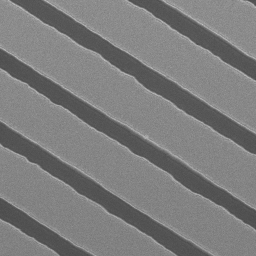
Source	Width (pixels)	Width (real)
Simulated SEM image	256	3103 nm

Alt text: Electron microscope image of lines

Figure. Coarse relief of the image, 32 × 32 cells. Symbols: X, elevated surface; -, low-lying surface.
XX----XXXXXXXXXXX----XXXXXXXXXXX
XXXX----XXXXXXXXXXX---XXXXXXXXXX
XXXXX----XXXXXXXXXXX----XXXXXXXX
XXXXXXX----XXXXXXXXXXX----XXXXXX
XXXXXXXX----XXXXXXXXXXX----XXXXX
XXXXXXXXXX----XXXXXXXXXXX----XXX
-XXXXXXXXXXX----XXXXXXXXXX----XX
--XXXXXXXXXXX----XXXXXXXXXXX----
----XXXXXXXXXXX----XXXXXXXXXX---
XX---XXXXXXXXXXXX---XXXXXXXXXXX-
XXX----XXXXXXXXXXX----XXXXXXXXXX
XXXXX----XXXXXXXXXX-----XXXXXXXX
XXXXXX----XXXXXXXXXXX----XXXXXXX
XXXXXXXX----XXXXXXXXXX-----XXXXX
XXXXXXXXXX---XXXXXXXXXXX----XXXX
XXXXXXXXXXX----XXXXXXXXXXX----XX
--XXXXXXXXXXX----XXXXXXXXXX----X
---XXXXXXXXXXX----XXXXXXXXXXX---
X----XXXXXXXXXXX----XXXXXXXXXXX-
XXX----XXXXXXXXXX----XXXXXXXXXXX
XXXXX---XXXXXXXXXXX----XXXXXXXXX
XXXXXX----XXXXXXXXXXX---XXXXXXXX
XXXXXXXX----XXXXXXXXXX----XXXXXX
XXXXXXXXX----XXXXXXXXXX----XXXXX
XXXXXXXXXXX----XXXXXXXXXX----XXX
-XXXXXXXXXXX----XXXXXXXXXXX----X
---XXXXXXXXXXX----XXXXXXXXXXX---
----XXXXXXXXXXX----XXXXXXXXXXX--
XX----XXXXXXXXXXX----XXXXXXXXXXX
XXXX---XXXXXXXXXXXX---XXXXXXXXXX
XXXXX----XXXXXXXXXXX----XXXXXXXX
XXXXXXX----XXXXXXXXXXX----XXXXXX